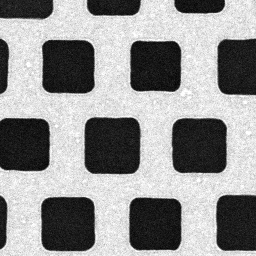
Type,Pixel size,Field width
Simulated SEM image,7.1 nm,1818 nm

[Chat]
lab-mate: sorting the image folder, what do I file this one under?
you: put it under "holes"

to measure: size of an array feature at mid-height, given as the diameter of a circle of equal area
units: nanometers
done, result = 421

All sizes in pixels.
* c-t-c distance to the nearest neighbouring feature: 87.3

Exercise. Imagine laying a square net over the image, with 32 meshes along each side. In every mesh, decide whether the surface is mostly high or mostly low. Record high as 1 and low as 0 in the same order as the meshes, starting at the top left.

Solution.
00000001111000000011110000001111
00000001111000000111111000011111
11111111111111111111111111111111
11111111111111111111111111111111
11111111111111111111111111111111
01111000000111111000001111100000
01111000000011110000000111100000
01111000000011110000000111100000
01111000000011110000000111100000
01111000000011110000000111100000
01111000000011110000000111100000
11111100000111111011111111110000
11111111111111111111111111111111
11111111111111111111111111111111
11111111111111111111111111111111
00000011111000000111110000001111
00000011110000000011100000001111
00000011110000000011100000001111
00000011110000000011100000001111
00000011110000000011100000001111
00000011111000000111110000001111
11111111111000000111110000001111
11111111111111111111111111111111
11111111111111111111111111111111
11111111111111111111111111110000
01111000000011110000000111100000
01111000000011110000000111100000
01111000000011110000000111100000
01111000000011110000000111100000
01111000000011110000000111100000
01111000000011110000000111100000
11111111001111111111111111111111